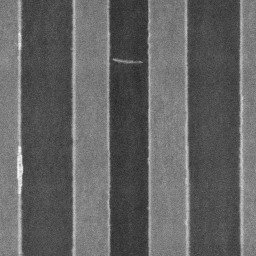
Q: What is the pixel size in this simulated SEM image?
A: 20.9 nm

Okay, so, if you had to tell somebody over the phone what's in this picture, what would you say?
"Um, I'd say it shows lines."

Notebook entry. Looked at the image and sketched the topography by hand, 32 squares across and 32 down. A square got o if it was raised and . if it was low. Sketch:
oo.......oooo......oooo.......oo
oo.......oooo......oooo.......oo
oo.......oooo......oooo.......oo
oo.......oooo......oooo.......oo
ooo......ooooo.....oooo.......oo
ooo......oooo......oooo.......oo
oo.......oooo......oooo.......oo
oo.......oooo......oooo.......oo
oo.......oooo......oooo.......oo
oo.......oooo......oooo.......oo
oo.......oooo......oooo.......oo
oo.......oooo......oooo.......oo
oo.......oooo......oooo.......oo
oo.......oooo......oooo.......oo
oo.......ooooo.....oooo.......oo
oo.......oooo......oooo.......oo
oo.......oooo......oooo.......oo
oo.......ooooo.....oooo.......oo
ooo......ooooo.....oooo.......oo
ooo......ooooo.....oooo.......oo
ooo......ooooo.....oooo.......oo
ooo......ooooo.....oooo.......oo
ooo......ooooo.....oooo.......oo
ooo......ooooo.....oooo.......oo
oo.......ooooo.....oooo.......oo
oo.......ooooo.....oooo.......oo
oo.......ooooo.....oooo.......oo
oo.......ooooo.....oooo.......oo
oo.......ooooo.....oooo.......oo
oo.......ooooo.....oooo.......oo
oo.......ooooo.....oooo.......oo
oo.......ooooo.....oooo.......oo